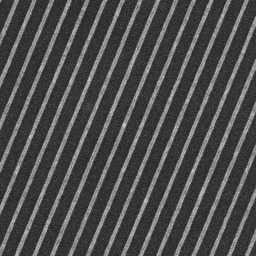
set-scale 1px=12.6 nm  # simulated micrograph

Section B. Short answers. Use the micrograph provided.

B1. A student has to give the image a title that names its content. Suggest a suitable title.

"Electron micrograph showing parallel lines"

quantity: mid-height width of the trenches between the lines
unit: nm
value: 169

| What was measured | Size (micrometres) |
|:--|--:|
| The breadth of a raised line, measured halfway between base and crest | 0.0365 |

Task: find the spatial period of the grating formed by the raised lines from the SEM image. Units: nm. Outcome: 206